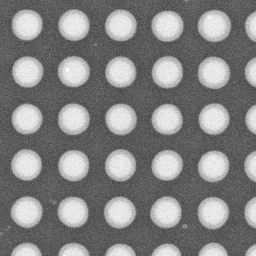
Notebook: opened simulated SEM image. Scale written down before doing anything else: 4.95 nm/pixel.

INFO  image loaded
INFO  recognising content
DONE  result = an array of small figures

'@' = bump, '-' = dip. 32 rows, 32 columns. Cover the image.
--------------------------------
--@@----@@----@@----@@----@@----
--@@@--@@@@--@@@@--@@@@--@@@@--@
--@@@--@@@@--@@@@--@@@@--@@@@--@
--@@@---@@@---@@@--@@@---@@@---@
--------------------------------
--------------------------------
--@@@---@@----@@----@@----@@---@
--@@@--@@@@--@@@@--@@@@--@@@@--@
--@@@--@@@@--@@@@--@@@@--@@@@--@
--@@@---@@----@@----@@---@@@---@
--------------------------------
--------------------------------
--@@@---@@----@@----@@----@@---@
--@@@--@@@@--@@@@--@@@@--@@@@--@
--@@@--@@@@--@@@@--@@@@--@@@@--@
--@@----@@----@@----@@----@@----
--------------------------------
--------------------------------
--@@@---@@@---@@@--@@@---@@@---@
-@@@@--@@@@--@@@@--@@@@--@@@@--@
--@@@--@@@@--@@@@--@@@@--@@@---@
---@-----@----@@----------@@----
--------------------------------
--------------------------------
--@@@---@@@--@@@@--@@@---@@@---@
-@@@@--@@@@--@@@@--@@@@--@@@@--@
--@@@---@@@--@@@@--@@@---@@@---@
--------------------------@-----
--------------------------------
---@----@@----------------@-----
--@@@--@@@@--@@@@--@@@---@@@---@